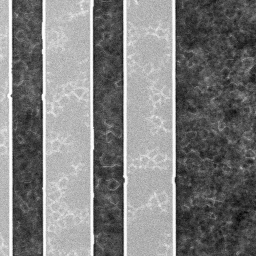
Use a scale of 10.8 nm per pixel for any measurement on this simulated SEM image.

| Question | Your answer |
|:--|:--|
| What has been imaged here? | one or a few lines or trenches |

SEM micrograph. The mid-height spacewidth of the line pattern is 360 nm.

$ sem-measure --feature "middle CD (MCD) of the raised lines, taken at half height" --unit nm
521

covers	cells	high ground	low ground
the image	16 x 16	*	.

*..***..***.....
*..***..***.....
*..***..***.....
*..***..***.....
*..***..***.....
*..***..***.....
*..***..***.....
*..***..***.....
*..***..***.....
*..***..***.....
*..***..***.....
*..***..***.....
*..***..***.....
*..***..***.....
*..***..***.....
*..***..***.....